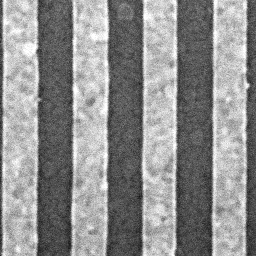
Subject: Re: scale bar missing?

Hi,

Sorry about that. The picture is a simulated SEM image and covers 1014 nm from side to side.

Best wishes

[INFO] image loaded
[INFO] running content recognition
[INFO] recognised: one or a few lines or trenches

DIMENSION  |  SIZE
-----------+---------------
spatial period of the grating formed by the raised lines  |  0.277 µm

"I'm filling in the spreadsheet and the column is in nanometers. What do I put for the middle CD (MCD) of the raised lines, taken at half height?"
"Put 127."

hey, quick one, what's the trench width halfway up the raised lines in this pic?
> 148 nm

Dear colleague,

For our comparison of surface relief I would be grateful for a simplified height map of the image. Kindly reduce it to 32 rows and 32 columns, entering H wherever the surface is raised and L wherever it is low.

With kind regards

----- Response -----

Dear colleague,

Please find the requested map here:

LHHHHLLLLHHHHLLLLLHHHHLLLLLHHHHL
LHHHHLLLLHHHHLLLLLHHHHLLLLLHHHHL
LHHHHLLLLHHHHLLLLLHHHHLLLLLHHHHL
LHHHHLLLLHHHHLLLLLHHHHLLLLLHHHHL
LHHHHLLLLHHHHLLLLLHHHHLLLLLHHHHL
LHHHHLLLLHHHHLLLLLHHHHLLLLLHHHHL
LHHHLLLLLHHHHLLLLLHHHHLLLLLHHHHL
LHHHHLLLLHHHHLLLLLHHHHLLLLLHHHHL
LHHHHLLLLHHHHLLLLLHHHHLLLLLHHHHL
LHHHHLLLLHHHHLLLLLHHHHLLLLLHHHHL
HHHHHLLLLHHHHLLLLLHHHHLLLLLHHHHL
HHHHHLLLLHHHHLLLLLHHHHLLLLLHHHHL
HHHHHLLLLHHHHLLLLLHHHHLLLLLHHHHL
HHHHHLLLLHHHHLLLLLHHHHLLLLLHHHHL
LHHHHLLLLHHHHLLLLLHHHHLLLLLHHHHL
LHHHHLLLLHHHHLLLLLHHHHLLLLLHHHHL
HHHHHLLLLHHHHLLLLLHHHHLLLLLHHHLL
HHHHHLLLLHHHHLLLLLHHHHLLLLLHHHHL
HHHHHLLLLHHHHLLLLLHHHHLLLLLHHHHL
HHHHHLLLLHHHHLLLLLHHHHLLLLLHHHHL
HHHHHLLLLHHHHLLLLLHHHHLLLLLHHHHL
HHHHHLLLLHHHHLLLLLHHHHLLLLLHHHHL
HHHHHLLLLHHHHLLLLLHHHHLLLLLHHHHL
HHHHLLLLLHHHHLLLLLHHHHLLLLLHHHHL
HHHHLLLLLHHHHLLLLLHHHHLLLLLHHHHL
HHHHHLLLLHHHHLLLLLHHHHLLLLLHHHHL
HHHHHLLLLHHHHLLLLLHHHHLLLLLHHHHL
HHHHLLLLLHHHHLLLLLHHHHLLLLLHHHHL
HHHHHLLLLHHHHLLLLLHHHHLLLLLHHHHL
LHHHHLLLLHHHHLLLLLHHHHLLLLLHHHHL
HHHHHLLLLHHHHLLLLLHHHHLLLLLHHHHL
HHHHHLLLLHHHHLLLLLHHHHLLLLLHHHHL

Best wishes